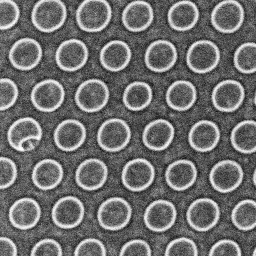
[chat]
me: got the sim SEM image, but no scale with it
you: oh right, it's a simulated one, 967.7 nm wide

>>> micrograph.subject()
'a regular array of raised bodies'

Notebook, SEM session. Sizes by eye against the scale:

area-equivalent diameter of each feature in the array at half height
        112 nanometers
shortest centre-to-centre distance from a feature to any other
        166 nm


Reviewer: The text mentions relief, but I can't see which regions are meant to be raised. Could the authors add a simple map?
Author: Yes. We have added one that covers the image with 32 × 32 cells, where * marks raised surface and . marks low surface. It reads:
**...***..***...**....**...***..
**..****..****..***..****..***..
**..****..****.****..****..***..
.....**...***...**....**...***..
................................
..***...**....**...**...***.....
.****..****..***..****..***...**
.****..****..***..****.****..***
..**....**...**....**...***...**
................................
**...**...***....*....**....**..
**..****..***...***..***...***..
**..****..***..****..***...***..
*....**...***...**....**...**...
................................
..***...**...***...**....**...**
.****..****.****..****..***..***
.**....***..****..***...***..***
........*....**....*....***...**
................................
**...**...***...***...**...***..
**..****..***..****..***..****..
**..***...***..****..***..****..
.....*.....*....**....*....**...
................................
..***..***...***...**...***...**
.****..***..****..****..***..***
.****..***..****..****..***..***
.............**....**...**....*.
................................
**...**...***...**...***...**...
**..****.****..****..****.****..